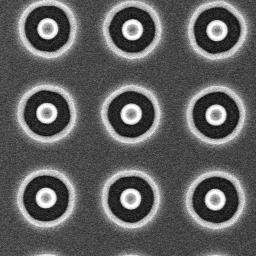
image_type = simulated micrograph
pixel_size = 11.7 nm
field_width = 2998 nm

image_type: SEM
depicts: an array of small figures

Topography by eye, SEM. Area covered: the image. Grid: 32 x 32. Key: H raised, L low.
HHHHHLLHHHHHHHHHHHHHHHHHHHHHHHHH
HHHLLLLLHHHHHHLLLLLHHHHHHLLLLHHH
HHHLLLLLLHHHHHLLLLLHHHHHLLLLLLHH
HHHLLHHLLHHHHLLHHHLLHHHHLLHHLLHH
HHHLLHHLLHHHHHLLHLLLHHHHLLHHLLHH
HHHLLLLLLHHHHHLLLLLHHHHHLLLLLLHH
HHHHHLLHHHHHHHHLLLHHHHHHHLLLLHHH
HHHHHHHHHHHHHHHHHHHHHHHHHHHHHHHH
HHHHHHHHHHHHHHHHHHHHHHHHHHHHHHHH
HHHHHHHHHHHHHHHHHHHHHHHHHHHHHHHH
HHHHHHHHHHHHHHHHHHHHHHHHHHHHHHHH
HHHHLLLLHHHHHHHLLLHHHHHHHHLLHHHH
HHHLLLLLLHHHHHLLLLLHHHHHLLLLLLHH
HHHLLHHLLHHHHLLLHLLLHHHHLLHHLLHH
HHHLLHHLLHHHHLLHHLLLHHHHLLHHLLHH
HHHLLLLLLHHHHLLLLLLHHHHHLLLLLLHH
HHHHLLLLHHHHHHLLLLLHHHHHHLLLLHHH
HHHHHHHHHHHHHHHHLHHHHHHHHHLLHHHH
HHHHHHHHHHHHHHHHHHHHHHHHHHHHHHHH
HHHHHHHHHHHHHHHHHHHHHHHHHHHHHHHH
HHHHHHHHHHHHHHHHHHHHHHHHHHHHHHHH
HHHHHHHHHHHHHHHHHHHHHHHHHHHHHHHH
HHHHLLLLHHHHHHLLLLLHHHHHHLLLLHHH
HHHLLLLLLHHHHLLLLLLHHHHHLLLLLLHH
HHHLLHHLLHHHHLLHHLLLHHHHLLHHLLHH
HHHLLHLLLHHHHLLLHLLLHHHHLLHHLLHH
HHHLLLLLHHHHHHLLLLLHHHHHLLLLLLHH
HHHHLLLHHHHHHHHLLLHHHHHHHLLLLHHH
HHHHHHHHHHHHHHHHHHHHHHHHHHHHHHHH
HHHHHHHHHHHHHHHHHHHHHHHHHHHHHHHH
HHHHHHHHHHHHHHHHHHHHHHHHHHHHHHHH
HHHHHHHHHHHHHHHHHHHHHHHHHHHHHHHH